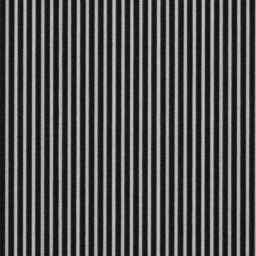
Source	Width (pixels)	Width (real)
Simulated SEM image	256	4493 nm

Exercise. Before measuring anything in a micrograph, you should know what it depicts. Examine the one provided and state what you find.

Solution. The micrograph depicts parallel lines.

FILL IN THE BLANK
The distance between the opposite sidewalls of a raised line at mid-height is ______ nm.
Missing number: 46.1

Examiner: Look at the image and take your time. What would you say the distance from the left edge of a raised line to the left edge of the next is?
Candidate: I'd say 8.92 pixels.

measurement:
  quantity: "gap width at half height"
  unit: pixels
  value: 6